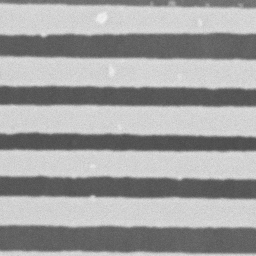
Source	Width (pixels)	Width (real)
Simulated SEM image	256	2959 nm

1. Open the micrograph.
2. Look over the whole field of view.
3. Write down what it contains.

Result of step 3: lines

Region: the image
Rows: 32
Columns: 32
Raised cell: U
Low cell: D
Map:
DDDDDDDDDDDDDDDDDDDDDDDDDDDDDDDD
UUUUUUUUUUUUUUUUUUUUUUUUUUUUUUUU
UUUUUUUUUUUUUUUUUUUUUUUUUUUUUUUU
UUUUUUUUUUUUUUUUUUUUUUUUUUUUUUUU
DDDDDDDDDDDDDDDDDDDDDDDDDDDDDDDD
DDDDDDDDDDDDDDDDDDDDDDDDDDDDDDDD
DDDDDDDDDDDDDDDDDDDDDDDDDDDDDDDD
UUUUUUUUUUUUUUUUUUUUUUUUUUUUUUDD
UUUUUUUUUUUUUUUUUUUUUUUUUUUUUUUU
UUUUUUUUUUUUUUUUUUUUUUUUUUUUUUUU
UUUUUUUUUUUUUUUUUUUUUUUUUUUUUUUU
DDDDDDDDDDDDDDDDDDDDDDDDDDDDDDDD
DDDDDDDDDDDDDDDDDDDDDDDDDDDDDDDD
UUUUUUUUUUUUUUUUUUUUUUUUUUUUUUUU
UUUUUUUUUUUUUUUUUUUUUUUUUUUUUUUU
UUUUUUUUUUUUUUUUUUUUUUUUUUUUUUUU
UUUUUUUUUUUUUUUUUUUUUUUUUUUUUUUU
DDDDDDDDDDDDDDDDDDDDDDDDDDDDDDDD
DDDDDDDDDDDDDDDDDDDDDDDDDDDDDDDD
UUUUUUUUUUUUUUUUUUUUUUUUUUUUUUUU
UUUUUUUUUUUUUUUUUUUUUUUUUUUUUUUU
UUUUUUUUUUUUUUUUUUUUUUUUUUUUUUUU
DDDDDDDDDDDDDDDDDDDDDDDDDDDDDDDD
DDDDDDDDDDDDDDDDDDDDDDDDDDDDDDDD
DDDDDDDDDDDDDDDDDDDDDDDDDDDDDDDD
UUUUUUUUUUUUUUUUUUUUUUUUUUUUUUUU
UUUUUUUUUUUUUUUUUUUUUUUUUUUUUUUU
UUUUUUUUUUUUUUUUUUUUUUUUUUUUUUUU
DDDDDDDDDDDDDDDDDDDDDDDDDDDDDDDD
DDDDDDDDDDDDDDDDDDDDDDDDDDDDDDDD
DDDDDDDDDDDDDDDDDDDDDDDDDDDDDDDD
UUUDUDDUUUUDDDDDDDDDDDDDDDDDDDDD